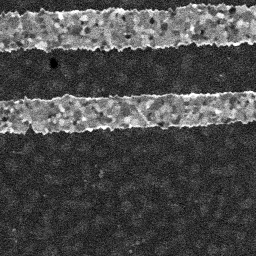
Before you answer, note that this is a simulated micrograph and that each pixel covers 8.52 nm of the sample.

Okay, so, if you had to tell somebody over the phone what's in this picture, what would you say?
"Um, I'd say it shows one or a few lines or trenches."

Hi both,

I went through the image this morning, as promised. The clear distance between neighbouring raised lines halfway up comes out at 419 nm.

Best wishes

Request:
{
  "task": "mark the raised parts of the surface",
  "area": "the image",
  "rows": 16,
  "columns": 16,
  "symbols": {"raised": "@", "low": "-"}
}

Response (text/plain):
-----------@@@@@
@@@@@@@@@@@@@@@@
@@@@@@@@@@@@@@@@
----------------
----------------
----------------
@@@@@@@@@@@@@@@@
@@@@@@@@@@@@@@@@
----------------
----------------
----------------
----------------
----------------
----------------
----------------
----------------